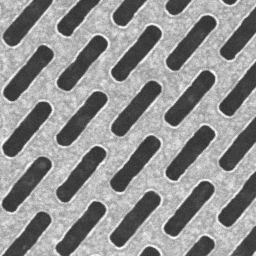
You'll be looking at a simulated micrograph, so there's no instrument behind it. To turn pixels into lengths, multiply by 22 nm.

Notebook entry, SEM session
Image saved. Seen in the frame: a regular array of holes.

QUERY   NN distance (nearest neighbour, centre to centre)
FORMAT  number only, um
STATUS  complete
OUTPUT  1.21